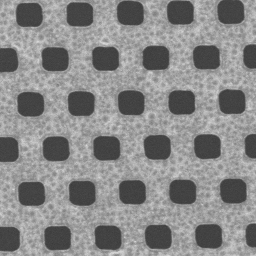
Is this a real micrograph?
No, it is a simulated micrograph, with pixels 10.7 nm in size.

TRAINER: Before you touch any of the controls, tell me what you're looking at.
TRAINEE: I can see a regular array of holes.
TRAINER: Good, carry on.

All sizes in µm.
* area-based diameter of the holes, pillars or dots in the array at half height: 0.3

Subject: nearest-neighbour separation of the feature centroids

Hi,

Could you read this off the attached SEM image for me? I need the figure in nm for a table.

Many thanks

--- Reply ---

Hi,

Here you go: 538